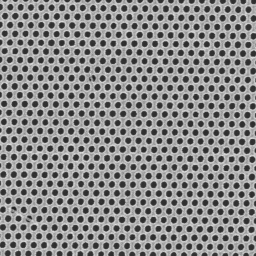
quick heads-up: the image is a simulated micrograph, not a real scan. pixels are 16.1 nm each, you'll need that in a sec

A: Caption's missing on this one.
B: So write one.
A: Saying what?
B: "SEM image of a regular array of holes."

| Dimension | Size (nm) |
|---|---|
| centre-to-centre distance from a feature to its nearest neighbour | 160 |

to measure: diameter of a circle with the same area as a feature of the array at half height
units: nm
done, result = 104